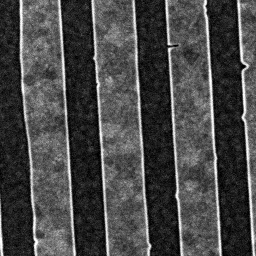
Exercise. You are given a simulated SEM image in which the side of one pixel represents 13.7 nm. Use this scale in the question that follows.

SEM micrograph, one or a few lines or trenches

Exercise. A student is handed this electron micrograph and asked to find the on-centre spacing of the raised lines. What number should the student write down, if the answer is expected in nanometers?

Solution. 1000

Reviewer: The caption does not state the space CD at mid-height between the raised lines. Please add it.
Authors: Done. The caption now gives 449 nanometres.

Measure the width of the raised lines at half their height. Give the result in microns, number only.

0.549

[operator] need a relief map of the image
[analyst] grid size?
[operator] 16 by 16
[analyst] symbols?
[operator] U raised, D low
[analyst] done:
DUUUDDUUDDUUUDDU
DUUUDDUUDDUUUDDU
DUUUDDUUUDDUUDDU
DUUUDDUUUDDUUDDU
DUUUDDUUUDDUUDDU
DUUUDDUUUDDUUDDU
DUUUDDUUUDDUUDDU
DDUUDDUUUDDUUDDU
DDUUDDUUUDDUUDDU
DDUUDDUUUDDUUDDU
DDUUDDUUUDDUUUDD
DDUUDDUUUDDUUUDD
DDUUDDDUUDDUUUDD
DDUUDDDUUDDUUUDD
DDUUUDDUUDDUUUDD
DDUUUDDUUDDUUUDD